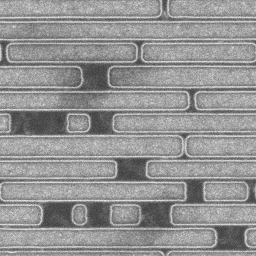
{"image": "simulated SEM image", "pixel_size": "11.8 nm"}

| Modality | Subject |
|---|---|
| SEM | parallel lines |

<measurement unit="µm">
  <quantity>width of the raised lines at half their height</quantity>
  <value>0.0622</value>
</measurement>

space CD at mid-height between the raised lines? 210 nm